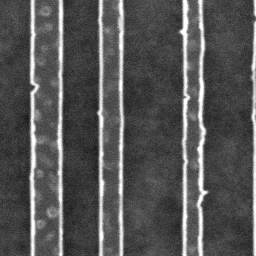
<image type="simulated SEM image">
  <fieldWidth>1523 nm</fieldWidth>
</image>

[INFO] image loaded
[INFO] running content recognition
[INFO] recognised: one or a few lines or trenches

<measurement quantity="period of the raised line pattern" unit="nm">436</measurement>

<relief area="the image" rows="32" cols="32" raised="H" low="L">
LLLLHHHHLLLLLHHLLLLLLLLHHLLLLLLL
LLLLHHHHLLLLLHHLLLLLLLLHHLLLLLLL
LLLLHHHHLLLLHHHLLLLLLLLHHLLLLLLL
LLLLHHHHLLLLLHHLLLLLLLLHHLLLLLLL
LLLLHHHHLLLLLHHLLLLLLLLHHLLLLLLL
LLLLHHHHLLLLLHHLLLLLLLLHHLLLLLLL
LLLLHHHHLLLLLHHLLLLLLLLHHLLLLLLL
LLLLHHHHLLLLLHHLLLLLLLLHHLLLLLLL
LLLLHHHHLLLLLHHLLLLLLLLHHLLLLLLL
LLLLHHHHLLLLLHHLLLLLLLLHHLLLLLLL
LLLLHHHHLLLLLHHLLLLLLLLHHLLLLLLL
LLLLHHHHLLLLLHHLLLLLLLLHHLLLLLLL
LLLLHHHHLLLLLHHLLLLLLLLHHLLLLLLL
LLLLHHHHLLLLHHHLLLLLLLLHHLLLLLLL
LLLLHHHHLLLLHHHLLLLLLLLHHLLLLLLL
LLLLHHHHLLLLLHHLLLLLLLLHHLLLLLLL
LLLLHHHHLLLLLHHLLLLLLLLHHHLLLLLL
LLLLHHHHLLLLLHHLLLLLLLLHHLLLLLLL
LLLLHHHHLLLLLHHLLLLLLLLHHLLLLLLL
LLLLHHHHLLLLLHHLLLLLLLLHHLLLLLLL
LLLLHHHHLLLLLHHLLLLLLLLHHLLLLLLL
LLLLHHHHLLLLLHHLLLLLLLLHHLLLLLLL
LLLLHHHHLLLLLHHLLLLLLLLHHLLLLLLL
LLLLHHHHLLLLLHHLLLLLLLLHHLLLLLLL
LLLLHHHHLLLLLHHLLLLLLLLHHLLLLLLL
LLLLHHHHLLLLLHHLLLLLLLLHHLLLLLLL
LLLLHHHHLLLLLHHLLLLLLLLHHLLLLLLL
LLLLHHHHLLLLLHHLLLLLLLLHHLLLLLLL
LLLLHHHHLLLLLHHLLLLLLLLHHLLLLLLL
LLLLHHHHLLLLLHHLLLLLLLLHHLLLLLLL
LLLLHHHHLLLLLHHLLLLLLLLHHLLLLLLL
LLLLHHHHLLLLLHHLLLLLLLLHHLLLLLLL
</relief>